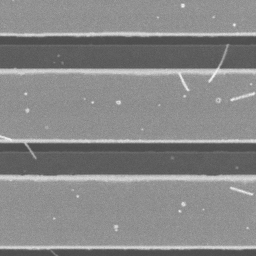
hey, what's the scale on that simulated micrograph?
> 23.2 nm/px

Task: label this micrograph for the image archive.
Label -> lines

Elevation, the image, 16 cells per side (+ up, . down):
++++++++++++++++
++++++++++++++++
................
................
++++++++++++++++
++++++++++++++++
++++++++++++++++
++++++++++++++++
++++++++++++++++
................
................
++++++++++++++++
++++++++++++++++
++++++++++++++++
++++++++++++++++
++++++++++++++++